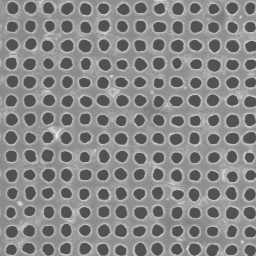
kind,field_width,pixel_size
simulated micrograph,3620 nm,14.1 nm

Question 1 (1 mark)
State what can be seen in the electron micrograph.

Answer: a regular array of holes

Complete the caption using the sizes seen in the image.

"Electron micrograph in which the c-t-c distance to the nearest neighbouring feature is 251 nanometers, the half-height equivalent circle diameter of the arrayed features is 159 nm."